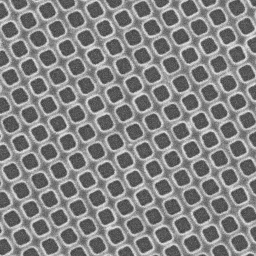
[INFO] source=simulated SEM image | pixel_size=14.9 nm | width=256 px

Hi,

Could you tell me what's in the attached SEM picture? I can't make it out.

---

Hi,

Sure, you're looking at a regular array of holes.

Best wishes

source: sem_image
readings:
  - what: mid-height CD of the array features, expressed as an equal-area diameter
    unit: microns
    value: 0.245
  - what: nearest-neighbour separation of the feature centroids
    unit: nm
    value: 310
